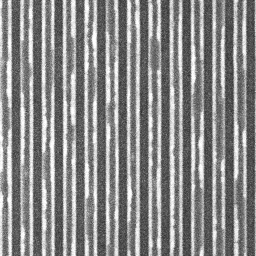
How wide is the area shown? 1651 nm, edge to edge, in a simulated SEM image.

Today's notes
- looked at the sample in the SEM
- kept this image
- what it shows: parallel lines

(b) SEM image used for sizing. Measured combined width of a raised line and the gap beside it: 138 nm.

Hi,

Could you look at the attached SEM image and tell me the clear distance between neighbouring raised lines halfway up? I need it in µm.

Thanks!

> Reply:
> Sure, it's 0.058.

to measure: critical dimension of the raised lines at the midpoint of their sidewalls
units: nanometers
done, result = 75.8